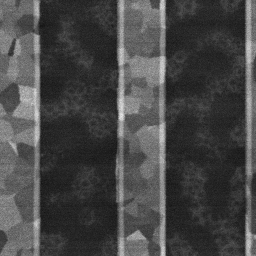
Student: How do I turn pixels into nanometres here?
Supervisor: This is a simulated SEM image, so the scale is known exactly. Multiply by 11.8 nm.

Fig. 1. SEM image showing one or a few lines or trenches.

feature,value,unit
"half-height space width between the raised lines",1.02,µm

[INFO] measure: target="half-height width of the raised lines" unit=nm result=474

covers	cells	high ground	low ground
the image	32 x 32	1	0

11110000000000011111000000000001
11110000000000011111000000000001
11110000000000011111000000000001
11110000000000011111000000000001
11110000000000011111000000000001
11110000000000011111000000000001
11110000000000011111000000000001
11111000000000011111000000000001
11111000000000011111000000000001
11111000000000011111000000000001
11111000000000011111000000000001
11111000000000011111000000000001
11111000000000011111000000000001
11111000000000011111000000000001
11111000000000011111000000000001
11111000000000011111000000000001
11111000000000011111000000000001
11111000000000011111000000000001
11111000000000011111000000000001
11111000000000011111000000000001
11111000000000011111000000000001
11111000000000011111000000000001
11111000000000011111000000000001
11111000000000011111000000000001
11110000000000011111000000000001
11110000000000011111000000000001
11110000000000011111000000000001
11110000000000011111000000000001
11110000000000011111000000000001
11110000000000011111000000000001
11110000000000011111000000000001
11110000000000011111000000000001